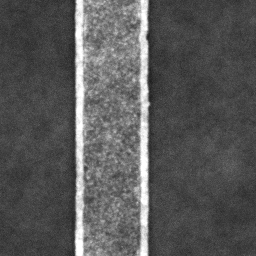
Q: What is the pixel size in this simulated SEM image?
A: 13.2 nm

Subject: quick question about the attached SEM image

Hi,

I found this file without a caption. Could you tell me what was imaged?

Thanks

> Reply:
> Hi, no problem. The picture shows one or a few lines or trenches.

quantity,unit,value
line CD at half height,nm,841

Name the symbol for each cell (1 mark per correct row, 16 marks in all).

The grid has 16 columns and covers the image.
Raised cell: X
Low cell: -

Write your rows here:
-----XXXX-------
-----XXXX-------
-----XXXX-------
-----XXXX-------
-----XXXX-------
-----XXXX-------
-----XXXX-------
-----XXXX-------
-----XXXX-------
-----XXXX-------
-----XXXX-------
-----XXXX-------
-----XXXX-------
-----XXXX-------
-----XXXX-------
-----XXXX-------